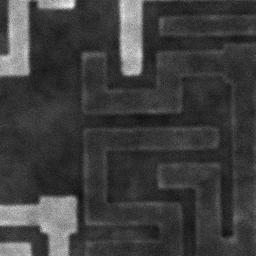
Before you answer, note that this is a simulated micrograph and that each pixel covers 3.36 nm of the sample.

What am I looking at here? wiring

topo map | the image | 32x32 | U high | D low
DUUDDUUUUDDDDDDUUUDDDDDDDDDDDDDD
DUUDDDDDDDDDDDDUUUDDDDDDDDDDDDDD
DUUDDDDDDDDDDDDUUUDDUUUUUUUUUUUU
DUUDDDDDDDDDDDDUUUDDUUUUUUUUUUUU
DUUDDDDDDDDDDDDUUUDDDDDDDDDDDDDD
DUUDDDDDDDDDDDDUUUDDDDDDDDDDDDDD
DUUDDDDDDDDDDDDUUUDDDDDDDDUUUUUU
UUUDDDDDDDUUUDDUUUDDUUUUUUUUUUUU
UUUUDDDDDDUUUDDUUUDDUUUUUUUUUUUU
DDDDDDDDDDUUUDDDDDDDUUUDDDDDUUUU
DDDDDDDDDDUUUDDDDDDDUUUDDDDDDUUU
DDDDDDDDDDUUUUUUUUUUUUUDDDDDDUUU
DDDDDDDDDDUUUUUUUUUUUUUDDDDDDUUU
DDDDDDDDDDUUUUUUUUUDUUUDDDDDDUUU
DDDDDDDDDDDDDDDDDDDDDDDDDDDDDUUU
DDDDDDDDDDDDDDDDDDDDDDDDDDDDDUUU
DDDDDDDDDDDUUUUUUUUUUUDUUUUDDUUU
DDDDDDDDDDDUUUUUUUUUUUUUUUUDDUUU
DDDDDDDDDDDUUUUUUUUUUUUUUUUDDUUU
DDDDDDDDDDDUUDDDDDDDDDDDDDDDDUUU
DDDDDDDDDDDUUDDDDDDDDUUUUUUDDUUU
DDDDDDDDDDDUUDDDDDDDUUUUUUUDDUUU
DDDDDDDDDDDUUDDDDDDDUUUUUUUDDUUU
DDDDDDDDDDDUUDDDDDDDDDDDUUUDDUUU
DDDDDDDDDDDUUDDDDDDDDDDDDUUDDUUU
DDDDDUUUUUDUUUUUUUUDUUDDDUUDDUUU
UUUUUUUUUDDDUUUUUUUUUUUDDUUUDUUU
UUUUUUUUUUDDDUUUUUUUUUUDDUUUDUUU
DDDDDUUUUUDDDDDDDDDDUUUDDUUUDUUU
DDDDDDUUUDDDDDDDDDDDUUUDDUUUDUUU
DDDDDDUUDDDUUUUUUUUUUUUDDUUUUUUU
UUUUDDUUDDDUUUUUUUUUUUUDDUUUUUUU